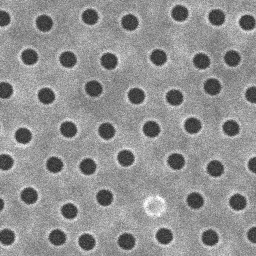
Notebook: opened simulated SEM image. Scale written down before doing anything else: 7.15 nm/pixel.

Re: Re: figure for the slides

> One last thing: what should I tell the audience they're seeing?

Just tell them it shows a regular array of holes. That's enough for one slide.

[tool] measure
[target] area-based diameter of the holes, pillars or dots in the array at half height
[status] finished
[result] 0.135 µm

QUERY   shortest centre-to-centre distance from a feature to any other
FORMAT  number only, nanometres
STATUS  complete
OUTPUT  265